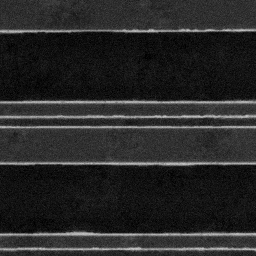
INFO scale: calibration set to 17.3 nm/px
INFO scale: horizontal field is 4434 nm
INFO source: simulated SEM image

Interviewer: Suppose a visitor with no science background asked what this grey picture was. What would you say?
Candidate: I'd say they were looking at lines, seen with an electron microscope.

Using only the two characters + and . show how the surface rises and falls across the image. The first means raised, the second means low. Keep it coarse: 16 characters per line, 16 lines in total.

++++++++++++++++
++++++++++++++++
................
................
................
................
++++++++++++++++
++++++++++++++++
++++++++++++++++
++++++++++++++++
................
................
................
................
................
++++++++++++++++